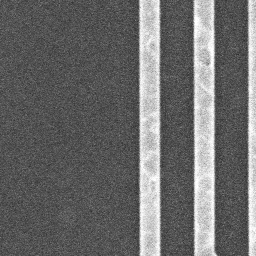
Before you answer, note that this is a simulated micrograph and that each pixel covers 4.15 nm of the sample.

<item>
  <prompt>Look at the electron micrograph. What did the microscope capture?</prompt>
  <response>parallel lines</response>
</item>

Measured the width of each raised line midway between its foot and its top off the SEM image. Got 77.9 nm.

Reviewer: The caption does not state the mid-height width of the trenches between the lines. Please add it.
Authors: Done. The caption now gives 0.148 µm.